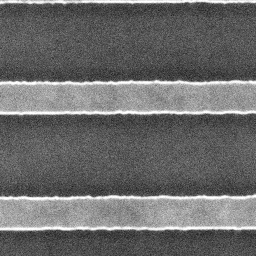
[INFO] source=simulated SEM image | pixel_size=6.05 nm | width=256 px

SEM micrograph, lines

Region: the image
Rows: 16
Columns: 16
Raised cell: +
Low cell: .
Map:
................
................
................
................
................
++++++++++++++++
++++++++++++++++
................
................
................
................
................
++++++++++++++++
++++++++++++++++
................
................